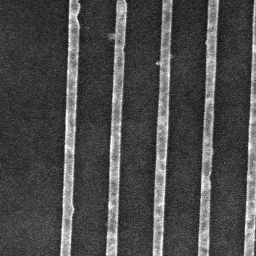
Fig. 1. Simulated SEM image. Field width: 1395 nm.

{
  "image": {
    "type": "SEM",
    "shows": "parallel lines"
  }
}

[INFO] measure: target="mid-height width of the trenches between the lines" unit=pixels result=37.1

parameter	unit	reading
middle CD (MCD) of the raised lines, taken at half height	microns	0.0504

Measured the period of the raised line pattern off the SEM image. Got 250 nanometers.